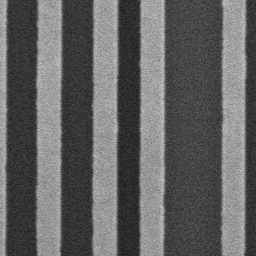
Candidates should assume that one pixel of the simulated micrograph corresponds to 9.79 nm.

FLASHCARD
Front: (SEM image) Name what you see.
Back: lines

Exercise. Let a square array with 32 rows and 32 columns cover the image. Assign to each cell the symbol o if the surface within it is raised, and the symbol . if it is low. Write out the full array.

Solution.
o....ooo....ooo...oo........ooo.
o....ooo....ooo...oo........ooo.
o....ooo....ooo...oo........ooo.
o....ooo....ooo...oo........ooo.
o....ooo....ooo...oo........ooo.
o....ooo....ooo...oo........ooo.
o....ooo....ooo...oo........ooo.
o....ooo....ooo...oo........ooo.
o....ooo....ooo...oo........ooo.
o....ooo....ooo...oo........ooo.
o....ooo....ooo...oo........ooo.
o....ooo....ooo...oo........ooo.
o....ooo....ooo...oo........ooo.
o....ooo....ooo...oo........ooo.
o....ooo....ooo...oo........ooo.
o....ooo....ooo...oo........ooo.
o....ooo....ooo...oo........ooo.
o....ooo....ooo...oo........ooo.
o....ooo....ooo...oo........ooo.
o....ooo....ooo...oo........ooo.
o....ooo....ooo...oo........ooo.
o....ooo....ooo...oo........ooo.
o....ooo....ooo...oo........ooo.
o....ooo....ooo...oo........ooo.
o....ooo....ooo...oo........ooo.
o....ooo....ooo...oo........ooo.
o....ooo....ooo...oo........ooo.
o....ooo....ooo...oo........ooo.
o....ooo....ooo...oo........ooo.
o....ooo....ooo...oo........ooo.
o....ooo....ooo...oo........ooo.
o....oo.....ooo...oo........oo..